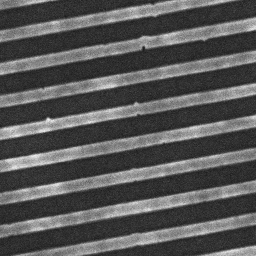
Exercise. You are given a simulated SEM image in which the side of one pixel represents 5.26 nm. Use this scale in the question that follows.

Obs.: parallel lines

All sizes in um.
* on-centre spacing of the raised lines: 0.169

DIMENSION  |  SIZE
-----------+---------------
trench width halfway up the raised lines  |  104 nm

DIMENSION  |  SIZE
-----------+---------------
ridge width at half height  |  64.1 nanometres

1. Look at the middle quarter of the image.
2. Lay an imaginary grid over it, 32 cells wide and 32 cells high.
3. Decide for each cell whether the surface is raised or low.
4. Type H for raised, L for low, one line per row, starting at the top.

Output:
LLLLLLLLLLLLLLLLLLLLLLLLLLHHHHHH
LLLLLLLLLLLLLLLLLLLLHHHHHHHHHHHH
LLLLLLLLLLLLLLHHHHHHHHHHHHHHHHHL
LLLLLLLLLHHHHHHHHHHHHHHHHLLLLLLL
LLLHHHHHHHHHHHHHHHHHLLLLLLLLLLLL
HHHHHHHHHHHHHHLLLLLLLLLLLLLLLLLL
HHHHHHHHLLLLLLLLLLLLLLLLLLLLLLLL
HHHLLLLLLLLLLLLLLLLLLLLLLLLLLLLL
LLLLLLLLLLLLLLLLLLLLLLLLLLHHHHHH
LLLLLLLLLLLLLLLLLLLLLLHHHHHHHHHH
LLLLLLLLLLLLLLLLHHHHHHHHHHHHHHHL
LLLLLLLLLLHHHHHHHHHHHHHHHHLLLLLL
LLLLLHHHHHHHHHHHHHHHLLLLLLLLLLLL
HHHHHHHHHHHHHHLLLLLLLLLLLLLLLLLL
HHHHHHHHHLLLLLLLLLLLLLLLLLLLLLLL
HHHLLLLLLLLLLLLLLLLLLLLLLLLLLLLL
LLLLLLLLLLLLLLLLLLLLLLLLLLLLHHHH
LLLLLLLLLLLLLLLLLLLLLLHHHHHHHHHH
LLLLLLLLLLLLLLLLHHHHHHHHHHHHHHHH
LLLLLLLLLHHHHHHHHHHHHHHHHHHLLLLL
LLLLHHHHHHHHHHHHHHHHHHLLLLLLLLLL
HHHHHHHHHHHHHHHHLLLLLLLLLLLLLLLL
HHHHHHHHHHHLLLLLLLLLLLLLLLLLLLLL
HHHHHLLLLLLLLLLLLLLLLLLLLLLLLLLL
LLLLLLLLLLLLLLLLLLLLLLLLLLLLHHHH
LLLLLLLLLLLLLLLLLLLLLLHHHHHHHHHH
LLLLLLLLLLLLLLLLLHHHHHHHHHHHHHHH
LLLLLLLLLLLHHHHHHHHHHHHHHHHHLLLL
LLLLLHHHHHHHHHHHHHHHHHLLLLLLLLLL
HHHHHHHHHHHHHHHHHLLLLLLLLLLLLLLL
HHHHHHHHHHHLLLLLLLLLLLLLLLLLLLLL
HHHHHLLLLLLLLLLLLLLLLLLLLLLLLLLL